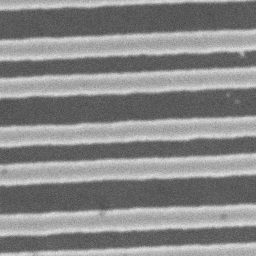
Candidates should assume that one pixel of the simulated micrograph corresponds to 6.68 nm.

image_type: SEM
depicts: lines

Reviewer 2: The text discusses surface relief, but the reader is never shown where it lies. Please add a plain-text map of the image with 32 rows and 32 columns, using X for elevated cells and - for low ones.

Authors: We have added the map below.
XXXXXXXXXXXXXXXX----------------
--------------------------------
--------------------------------
--------------------------------
--------------XXXXXXXXXXXXXXXXXX
XXXXXXXXXXXXXXXXXXXXXXXXXXXXXXXX
XXXXXXXXXXXXXXXXXXXXXXXXXX------
--------------------------------
-------------------------------X
---------XXXXXXXXXXXXXXXXXXXXXXX
XXXXXXXXXXXXXXXXXXXXXXXXXXXXXXXX
XXXXXXXXXXXXXXXXX---------------
--------------------------------
--------------------------------
--------------------------------
--------------XXXXXXXXXXXXXXXXXX
XXXXXXXXXXXXXXXXXXXXXXXXXXXXXXXX
XXXXXXXXXXXXXXXXX---------------
--------------------------------
----------------------------XXXX
----XXXXXXXXXXXXXXXXXXXXXXXXXXXX
XXXXXXXXXXXXXXXXXXXXXXXXXXXXXXXX
XXXXXXXXXXXX--------------------
--------------------------------
--------------------------------
--------------------------------
-----------XXXXXXXXXXXXXXXXXXXXX
XXXXXXXXXXXXXXXXXXXXXXXXXXXXXXXX
XXXXXXXXXXXXXXXXXXXXX--X--------
--------------------------------
-------------------------------X
-------XXXXXXXXXXXXXXXXXXXXXXXXX